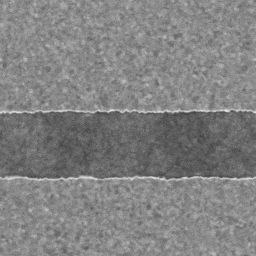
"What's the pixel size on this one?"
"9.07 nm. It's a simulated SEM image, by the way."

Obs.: one or a few lines or trenches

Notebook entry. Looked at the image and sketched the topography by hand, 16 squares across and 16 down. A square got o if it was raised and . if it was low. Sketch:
oooooooooooooooo
oooooooooooooooo
oooooooooooooooo
oooooooooooooooo
oooooooooooooooo
oooooooooooooooo
oooooooooooooooo
................
................
...........oo...
................
oooooooooooooooo
oooooooooooooooo
oooooooooooooooo
oooooooooooooooo
oooooooooooooooo